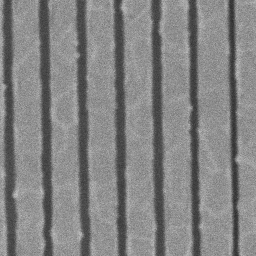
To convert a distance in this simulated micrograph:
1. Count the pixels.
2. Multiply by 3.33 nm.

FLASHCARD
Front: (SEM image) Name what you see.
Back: parallel lines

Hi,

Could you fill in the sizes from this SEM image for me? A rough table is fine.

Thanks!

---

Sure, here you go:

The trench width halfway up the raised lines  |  28.7 nm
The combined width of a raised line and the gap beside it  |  37.4 px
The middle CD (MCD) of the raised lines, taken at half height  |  94 nm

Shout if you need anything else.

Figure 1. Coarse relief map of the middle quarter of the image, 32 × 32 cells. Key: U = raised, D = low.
UUUDDDUUUUUUUDDUUUUUUUDDDUUUUUUD
UUUDDDUUUUUUUDDUUUUUUUDDDUUUUUUD
UUUDDDUUUUUUUDDUUUUUUUDDDUUUUUUD
UUUDDDUUUUUUUDDUUUUUUUDDDUUUUUUD
UUUDDDUUUUUUUDDUUUUUUUDDDUUUUUUD
UUUDDDUUUUUUUDDUUUUUUUDDDUUUUUUD
UUUDDDUUUUUUUDDUUUUUUUDDDUUUUUUD
UUUDDDUUUUUUUDDUUUUUUUDDDUUUUUUD
UUUDDDUUUUUUUDDUUUUUUUDDDUUUUUUD
UUUDDDUUUUUUUDDUUUUUUUDDDUUUUUUD
UUUDDDUUUUUUUDDUUUUUUUDDDUUUUUUU
UUUDDDUUUUUUUDDDUUUUUUDDUUUUUUUU
UUUUDDUUUUUUUDDDUUUUUUDDDUUUUUUU
UUUUDDUUUUUUUDDDUUUUUUDDDUUUUUUD
UUUUDDUUUUUUUDDDUUUUUUDDDUUUUUUU
UUUUDDUUUUUUUDDUUUUUUUDDDUUUUUUU
UUUUDDUUUUUUUDDUUUUUUUDDDUUUUUUD
UUUUDDUUUUUUUDDUUUUUUUDDDUUUUUUD
UUUUDDUUUUUUUDDDUUUUUUDDDUUUUUUU
UUUUDDUUUUUUUDDDUUUUUUDDDUUUUUUU
UUUUDDUUUUUUUDDDUUUUUUDDDUUUUUUD
UUUUDDUUUUUUUDDDUUUUUUDDDUUUUUUU
UUUUDDUUUUUUUDDDUUUUUUDDDUUUUUUU
UUUUDDUUUUUUUDDDUUUUUUDDDUUUUUUU
UUUUDDUUUUUUUDDDUUUUUUDDDUUUUUUU
UUUUDDUUUUUUUDDDUUUUUUDDDUUUUUUU
UUUUDDUUUUUUUDDUUUUUUUDDDUUUUUUU
UUUUDDUUUUUUUDDUUUUUUUDDDUUUUUUU
UUUUDDUUUUUUUDDUUUUUUUDDDUUUUUUU
UUUUDDUUUUUUUDDDUUUUUUDDDUUUUUUU
UUUUDDUUUUUUUDDDUUUUUUDDDUUUUUUU
UUUUDDUUUUUUUDDUUUUUUUDDDUUUUUUU